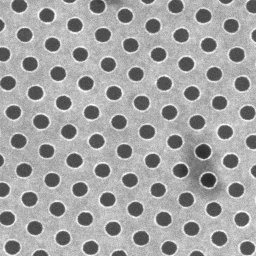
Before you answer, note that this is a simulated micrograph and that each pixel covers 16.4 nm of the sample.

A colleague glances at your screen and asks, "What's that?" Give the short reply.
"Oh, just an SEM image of a regular array of holes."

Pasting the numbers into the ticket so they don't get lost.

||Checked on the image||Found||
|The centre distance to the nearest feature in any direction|480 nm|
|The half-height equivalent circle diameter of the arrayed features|258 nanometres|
